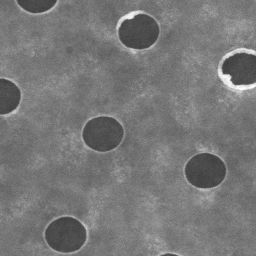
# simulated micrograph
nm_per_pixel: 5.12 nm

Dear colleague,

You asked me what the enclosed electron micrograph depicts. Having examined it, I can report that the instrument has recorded holes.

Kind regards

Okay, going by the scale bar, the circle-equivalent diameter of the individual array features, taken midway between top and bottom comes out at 197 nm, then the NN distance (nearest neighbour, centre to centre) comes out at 552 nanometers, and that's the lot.